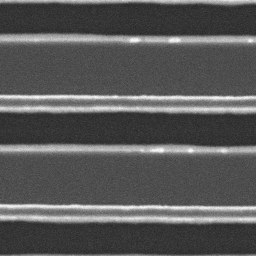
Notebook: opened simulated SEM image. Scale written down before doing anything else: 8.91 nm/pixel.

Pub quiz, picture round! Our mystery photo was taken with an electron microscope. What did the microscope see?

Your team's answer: lines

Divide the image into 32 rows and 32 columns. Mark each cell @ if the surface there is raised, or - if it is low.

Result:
--------------------------------
--------------------------------
--------------------------------
--------------------------------
--------------------------------
@@@@@@@@@@@@@@@@@@@@@@@@@@@@@@@@
@@@@@@@@@@@@@@@@@@@@@@@@@@@@@@@@
@@@@@@@@@@@@@@@@@@@@@@@@@@@@@@@@
@@@@@@@@@@@@@@@@@@@@@@@@@@@@@@@@
@@@@@@@@@@@@@@@@@@@@@@@@@@@@@@@@
@@@@@@@@@@@@@@@@@@@@@@@@@@@@@@@@
@@@@@@@@@@@@@@@@@@@@@@@@@@@@@@@@
@@@@@@@@@@@@@@@@@@@@@@@@@@@@@@@@
@@@@@@@@@@@@@@@@@@@@@@@@@@@@@@@@
--------------------------------
--------------------------------
--------------------------------
--------------------------------
--------------------------------
@@@@@@@@@@@@@@@@@@@@@@@@@@@@@@@@
@@@@@@@@@@@@@@@@@@@@@@@@@@@@@@@@
@@@@@@@@@@@@@@@@@@@@@@@@@@@@@@@@
@@@@@@@@@@@@@@@@@@@@@@@@@@@@@@@@
@@@@@@@@@@@@@@@@@@@@@@@@@@@@@@@@
@@@@@@@@@@@@@@@@@@@@@@@@@@@@@@@@
@@@@@@@@@@@@@@@@@@@@@@@@@@@@@@@@
@@@@@@@@@@@@@@@@@@@@@@@@@@@@@@@@
--------------------------------
--------------------------------
--------------------------------
--------------------------------
--------------------------------